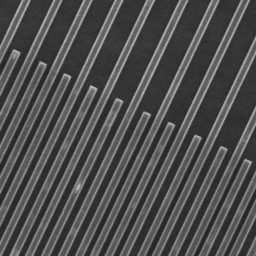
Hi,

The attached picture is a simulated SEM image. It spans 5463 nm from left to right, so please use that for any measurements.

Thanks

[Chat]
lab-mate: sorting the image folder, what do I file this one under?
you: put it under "parallel lines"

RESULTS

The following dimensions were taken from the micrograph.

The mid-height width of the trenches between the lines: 152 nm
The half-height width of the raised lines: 150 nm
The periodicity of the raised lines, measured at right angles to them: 304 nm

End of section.